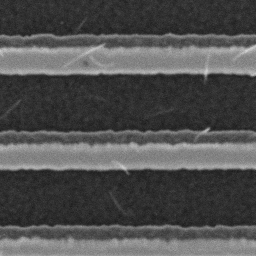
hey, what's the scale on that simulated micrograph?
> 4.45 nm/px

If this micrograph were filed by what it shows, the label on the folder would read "lines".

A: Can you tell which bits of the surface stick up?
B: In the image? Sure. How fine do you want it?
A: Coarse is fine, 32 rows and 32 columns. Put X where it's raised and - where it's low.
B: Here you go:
--------------------------------
--------------------------------
--------------------------------
--------------------------------
X---XXX--XXX-XXXXXX-XX-XXXXX--XX
XXXXXXXXXXXXXXXXXXXXXXXXXXXXXXXX
XXXXXXXXXXXXXXXXXXXXXXXXXXXXXXXX
XXXXXXXXXXXXXXXXXXXXXXXXXXXXXXXX
XXXXXXXXXXXXXXXXXXXXXXXXXXXXXXXX
--------------------------------
--------------------------------
--------------------------------
--------------------------------
--------------------------------
--------------------------------
--------------------------------
-X--XXX--X--XX-XX-X-XXXXXXXXXXXX
XXXXXXXXXXXXXXXXXXXXXXXXXXXXXXXX
XXXXXXXXXXXXXXXXXXXXXXXXXXXXXXXX
XXXXXXXXXXXXXXXXXXXXXXXXXXXXXXXX
XXXXXXXXXXXXXXXXXXXXXXXXXXXXXXXX
--------------------------------
--------------------------------
--------------------------------
--------------------------------
--------------------------------
--------------------------------
--------------------------------
XXXXXXXXXXXXXXXXXXXXXXXXXXXXXXXX
XXXXXXXXXXXXXXXXXXXXXXXXXXXXXXXX
XXXXXXXXXXXXXXXXXXXXXXXXXXXXXXXX
XXXXXXXXXXXXXXXXXXXXXXXXXXXXXXXX